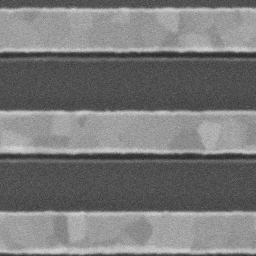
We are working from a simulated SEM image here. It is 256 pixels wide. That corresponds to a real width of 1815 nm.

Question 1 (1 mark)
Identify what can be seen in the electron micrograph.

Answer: lines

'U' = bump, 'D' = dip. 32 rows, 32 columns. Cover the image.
DDDDDDDDDDDDDDDDDDDDDDDDDDDDDDDD
UUUUUUUUUUUUUUUUUUUUUUUUUUUUUUUU
UUUUUUUUUUUUUUUUUUUUUUUUUUUUUUUU
UUUUUUUUUUUUUUUUUUUUUUUUUUUUUUUU
UUUUUUUUUUUUUUUUUUUUUUUUUUUUUUUU
UUUUUUUUUUUUUUUUUUUUUUUUUUUUUUUU
DDDDDDDDDDDDDDDDDDDDDDDDDDDDDDDD
DDDDDDDDDDDDDDDDDDDDDDDDDDDDDDDD
DDDDDDDDDDDDDDDDDDDDDDDDDDDDDDDD
DDDDDDDDDDDDDDDDDDDDDDDDDDDDDDDD
DDDDDDDDDDDDDDDDDDDDDDDDDDDDDDDD
DDDDDDDDDDDDDDDDDDDDDDDDDDDDDDDD
DDDDDDDDDDDDDDDDDDDDDDDDDDDDDDDD
DDDDDDDDDDDDDDDDDDDDDDDDDDDDDDDD
UUUUUUUUUUUUUUUUUUUUUUUUUUUUUUUU
UUUUUUUUUUUUUUUUUUUUUUUUUUUUUUUU
UUUUUUUUUUUUUUUUUUUUUUUUUUUUUUUU
UUUUUUUUUUUUUUUUUUUUUUUUUUUUUUUU
UUUUUUUUUUUUUUUUUUUUUUUUUUUUUUUU
DDDDDDDDDDDDDDDDDDDDDDDDDDDDDDDD
DDDDDDDDDDDDDDDDDDDDDDDDDDDDDDDD
DDDDDDDDDDDDDDDDDDDDDDDDDDDDDDDD
DDDDDDDDDDDDDDDDDDDDDDDDDDDDDDDD
DDDDDDDDDDDDDDDDDDDDDDDDDDDDDDDD
DDDDDDDDDDDDDDDDDDDDDDDDDDDDDDDD
DDDDDDDDDDDDDDDDDDDDDDDDDDDDDDDD
DDDDDDDDDDDDDDDDDDDDDDDDDDDDDDDD
UUUUUUUUUUUUUUUUUUUUUUUUUUUUUUUU
UUUUUUUUUUUUUUUUUUUUUUUUUUUUUUUU
UUUUUUUUUUUUUUUUUUUUUUUUUUUUUUUU
UUUUUUUUUUUUUUUUUUUUUUUUUUUUUUUU
UUUUUUUUUUUUUUUDUUUUUUUUUUUUUUUU